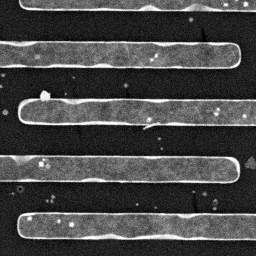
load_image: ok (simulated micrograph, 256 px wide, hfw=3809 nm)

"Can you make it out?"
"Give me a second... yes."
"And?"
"groups of lines, slits or small figures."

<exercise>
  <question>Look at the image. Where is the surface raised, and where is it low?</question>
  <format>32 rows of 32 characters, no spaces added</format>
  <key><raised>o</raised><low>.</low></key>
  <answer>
...ooooooooooooooooooooooooooooo
................................
................................
................................
................................
oo.ooooooooooooooooo.oooooo.o...
oooooooooooooooooooooooooooooo..
oooooooooooooooooooooooooooooo..
.......................oooooo...
................................
................................
................................
....oooo......ooo...............
...ooooooooooooooooooooooooooooo
..oooooooooooooooooooooooooooooo
................ooooo.oooooooooo
................................
................................
................................
oo..oo..........................
oooooooooooooooooooooooooooooo..
oooooooooooooooooooooooooooooo..
ooooooooooo.ooooooooooooooooo...
................................
................................
................................
................................
..oooooooooooooooooooooooooooooo
..oooooooooooooooooooooooooooooo
...ooooooooooooooooooooooooooooo
................................
................................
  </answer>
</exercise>